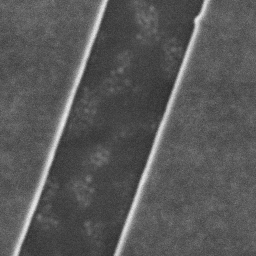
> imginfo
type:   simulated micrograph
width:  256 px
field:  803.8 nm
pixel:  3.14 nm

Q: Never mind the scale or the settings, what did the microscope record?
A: one or a few lines or trenches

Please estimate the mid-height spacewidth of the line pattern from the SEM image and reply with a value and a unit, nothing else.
292 nanometres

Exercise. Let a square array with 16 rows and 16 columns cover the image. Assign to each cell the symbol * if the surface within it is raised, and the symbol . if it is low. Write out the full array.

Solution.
******.......***
******......****
******......****
*****.......****
*****......*****
*****......*****
****.......*****
****......******
****......******
***......*******
***......*******
***......*******
**......********
**......********
**......********
*......*********